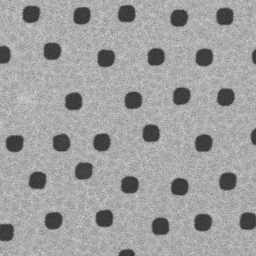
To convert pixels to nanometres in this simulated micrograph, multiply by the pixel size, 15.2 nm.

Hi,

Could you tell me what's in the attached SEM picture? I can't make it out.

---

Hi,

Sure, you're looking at a regular array of holes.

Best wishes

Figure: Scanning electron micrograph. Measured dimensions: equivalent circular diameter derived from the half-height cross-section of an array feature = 279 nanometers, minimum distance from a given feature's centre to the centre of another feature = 659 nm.